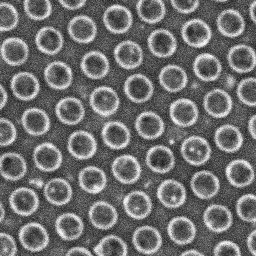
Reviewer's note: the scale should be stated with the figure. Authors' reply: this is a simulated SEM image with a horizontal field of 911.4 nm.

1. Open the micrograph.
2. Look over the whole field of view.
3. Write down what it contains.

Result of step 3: a regular array of raised bodies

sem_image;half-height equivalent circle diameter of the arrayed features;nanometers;90.8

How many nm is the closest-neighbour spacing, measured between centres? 126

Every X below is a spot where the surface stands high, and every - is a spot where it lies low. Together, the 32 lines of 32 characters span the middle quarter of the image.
-----XXXXXX----XXX--------------
X----XXXXXX--------------XXXX---
XX----XXXX--------------XXXXXX--
XX---------------XXX----XXXXXX--
X---------------XXXXX---XXXXXX--
X---------------XXXXXX---XXXXX--
--------XXXX----XXXXXX----XX----
-------XXXXXX---XXXXXX----------
-------XXXXXX----XXXX-----------
XXXX---XXXXXX---------------XXXX
XXXX---XXXXXX--------------XXXXX
XXXXX---XXXX---------------XXXXX
XXXXX-----X---------XX-----XXXXX
XXXX---------------XXXXX---XXXXX
XXX---------------XXXXXX----XXXX
-----------XXXX---XXXXXXX-------
----------XXXXXX---XXXXX--------
---XXX----XXXXXX---XXXXX--------
--XXXXX---XXXXXX----------------
-XXXXXXX---XXXXX--------------XX
-XXXXXXX----XXX---------------XX
--XXXXXX--------------XXXX----XX
--XXXXX--------------XXXXXX---XX
--------------XXX----XXXXXX---XX
-------------XXXXX---XXXXXX-----
------------XXXXXX---XXXXXX-----
-----XXXX---XXXXXXX----XXX------
----XXXXXX---XXXXXX-------------
----XXXXXX---XXXXX--------------
----XXXXXX-----XX---------XX----
X---XXXXXX--------------XXXXX---
X-----XXX---------------XXXXXX--